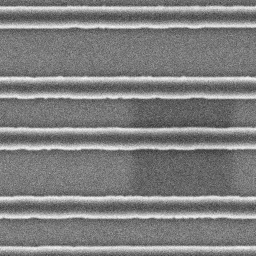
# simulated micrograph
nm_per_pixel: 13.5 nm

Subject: lines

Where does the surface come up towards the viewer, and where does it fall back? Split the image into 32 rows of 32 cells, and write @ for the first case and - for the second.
--------------------------------
@@@@@@@@@@@@@@@@@@@@@@@@@@@@@@@@
@@@@@@@@@@@@@@@@@@@@@@@@@@@@@@@@
--------------------------------
--------------------------------
--------------------------------
--------------------------------
--------------------------------
--------------------------------
--------------------------------
@@@@@@@@@@@@@@@@@@@@@@@@@@@@@@@@
@@@@@@@@@@@@@@@@@@@@@@@@@@@@@@@@
--------------------------------
--------------------------------
--------------------------------
--------------------------------
@@@@@@@@@@@@@@@@@@@@@@@@@@@@@@@@
@@@@@@@@@@@@@@@@@@@@@@@@@@@@@@@@
@@@@@@@@@@@@@@@@@@@@@@@@@@@@@@@@
--------------------------------
--------------------------------
--------------------------------
--------------------------------
--------------------------------
--------------------------------
@@@@@@@@@@@@@@@@@@@@@@@@@@@@@@@@
@@@@@@@@@@@@@@@@@@@@@@@@@@@@@@@@
--------------------------------
--------------------------------
--------------------------------
--------------------------------
@@@@@@@@@@@@@@@@@@@@@@@@@@@@@@@@